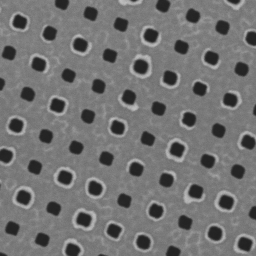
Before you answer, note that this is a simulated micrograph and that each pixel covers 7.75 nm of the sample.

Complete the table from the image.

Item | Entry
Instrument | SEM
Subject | a regular array of holes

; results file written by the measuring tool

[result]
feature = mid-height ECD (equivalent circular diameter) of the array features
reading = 111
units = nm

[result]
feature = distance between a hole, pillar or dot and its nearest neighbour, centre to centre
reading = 31.7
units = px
